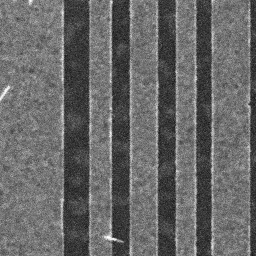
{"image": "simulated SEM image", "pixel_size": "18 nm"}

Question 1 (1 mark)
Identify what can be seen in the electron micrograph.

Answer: parallel lines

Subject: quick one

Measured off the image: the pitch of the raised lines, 782 nm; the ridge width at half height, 447 nanometers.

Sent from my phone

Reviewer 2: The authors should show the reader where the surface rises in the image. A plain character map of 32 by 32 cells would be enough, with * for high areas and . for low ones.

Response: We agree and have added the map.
********...***..****..**...****.
********...***..****..***..****.
********...***..****..**...****.
********...***..****..***..****.
********...***..****..**...****.
********...***..****..**...****.
********...***..****..**...****.
********...***..****..**...****.
********...***..****..***..****.
********...***..****..***..****.
********...***..****..***..****.
********...***..****..***..****.
********...***..****..**...****.
********...***..****..**...****.
********...***..****..**...****.
********...***..****..**...****.
********...***..****..**..*****.
********...***..****..**...****.
********...***..****..**..*****.
********...***..****..**..*****.
********...***..****..**..*****.
********...***..****..**..*****.
********...***..****..**..*****.
********...***..****..**..*****.
********...***..****..**...****.
********...***..****..**...****.
********...***..****..**...****.
********...***..****..**...****.
********...***..****..**..*****.
********...***..****..***..****.
********...***..****..**..*****.
********...***..****..**..*****.